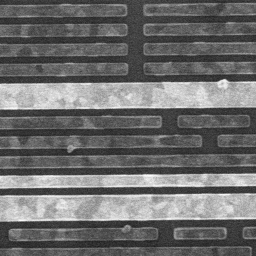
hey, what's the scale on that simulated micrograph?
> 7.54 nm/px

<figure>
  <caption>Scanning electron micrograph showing groups of lines, slits or small figures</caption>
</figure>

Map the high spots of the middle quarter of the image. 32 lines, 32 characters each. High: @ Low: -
@@@@@@@@@@@@@@@@----@@@@@@@@@@@@
@@@@@@@@@@@@@@@@----@@@@@@@@@@@@
@@@@@@@@@@@@@@@-----@@@@@@@@@@@@
--------------------------------
--------------------------------
@@@@@@@@@@@@@@@@@@@@@@@@@@@@@@@@
@@@@@@@@@@@@@@@@@@@@@@@@@@@@@@@@
@@@@@@@@@@@@@@@@@@@@@@@@@@@@@@@@
@@@@@@@@@@@@@@@@@@@@@@@@@@@@@@@@
@@@@@@@@@@@@@@@@@@@@@@@@@@@@@@@@
@@@@@@@@@@@@@@@@@@@@@@@@@@@@@@@@
--------------------------------
--------------------------------
@@@@@@@@@@@@@@@@@@@@@@@@-----@@@
@@@@@@@@@@@@@@@@@@@@@@@@-----@@@
@@@@@@@@@@@@@@@@@@@@@@@@-----@@@
--------------------------------
--------------------------------
@@@@@@@@@@@@@@@@@@@@@@@@@@@@@@@@
@@@@@@@@@@@@@@@@@@@@@@@@@@@@@@@@
@@@@@@@@@@@@@@@@@@@@@@--@@@@@@@@
-@------------------------------
--------------------------------
@@@@@@@@@@@@@@@@@@@@@@@@@@@@@@@@
@@@@@@@@@@@@@@@@@@@@@@@@@@@@@@@@
@@@@@@@@@@@@@@@@@---------------
--------------------------------
--------------------------------
@@@@@@@@@@@@@@@@@@@@@@@@@@@@@@@@
@@@@@@@@@@@@@@@@@@@@@@@@@@@@@@@@
@--@@@@@@@@@--------------------
--------------------------------